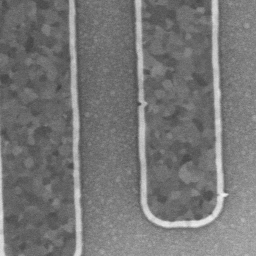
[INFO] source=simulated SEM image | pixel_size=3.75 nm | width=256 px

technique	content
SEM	one or a few lines or trenches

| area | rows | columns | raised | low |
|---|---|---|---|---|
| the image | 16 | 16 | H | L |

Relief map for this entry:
HHHHLLLLLHHHHLLL
HHHHLLLLLHHHHLLL
HHHHHLLLLHHHHLLL
HHHHHLLLLHHHHLLL
HHHHHLLLLHHHHLLL
HHHHHLLLLHHHHHLL
HHHHHLLLLHHHHHLL
HHHHHLLLLHHHHHLL
HHHHHLLLLHHHHHLL
HHHHHLLLLHHHHHLL
HHHHHLLLLHHHHHLL
HHHHHLLLLHHHHHLL
HHHHHLLLLHHHHHLL
HHHHHLLLLHHHHLLL
HHHHHLLLLLLLLLLL
HHHHHLLLLLLLLLLL